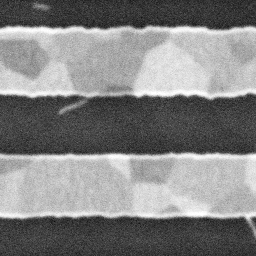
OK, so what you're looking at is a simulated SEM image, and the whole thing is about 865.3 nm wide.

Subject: lines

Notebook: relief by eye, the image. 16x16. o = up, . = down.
................
................
oooooooooooooooo
oooooooooooooooo
oooooooooooooooo
oooooooooooooooo
................
................
................
................
oooooooooooooooo
oooooooooooooooo
oooooooooooooooo
oo.......oo..oo.
................
................